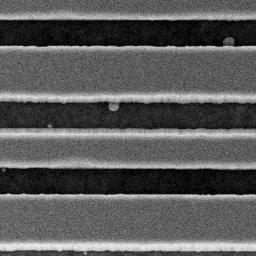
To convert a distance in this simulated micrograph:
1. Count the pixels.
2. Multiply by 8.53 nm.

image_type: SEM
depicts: lines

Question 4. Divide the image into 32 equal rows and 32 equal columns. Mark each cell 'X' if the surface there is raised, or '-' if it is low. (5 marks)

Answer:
XXXXXXXXXXXXXXXXXXXXXXXXXXXXXXXX
XXXXXXXXXXXXXXXXXXXXXXXXXXXXXXXX
--------------------------------
--------------------------------
--------------------------------
--------------------------------
XXXXXXXXXXXXXXXXXXXXXXXXXXXXXXXX
XXXXXXXXXXXXXXXXXXXXXXXXXXXXXXXX
XXXXXXXXXXXXXXXXXXXXXXXXXXXXXXXX
XXXXXXXXXXXXXXXXXXXXXXXXXXXXXXXX
XXXXXXXXXXXXXXXXXXXXXXXXXXXXXXXX
XXXXXXXXXXXXXXXXXXXXXXXXXXXXXXXX
-XXXXXXXXXXXXXXXXXXXXXXXXXXXXXXX
--------------------------------
--------------------------------
--------------------------------
XXXXXXXXXXXXXXXXXXXXXXXXXX-XXXXX
XXXXXXXXXXXXXXXXXXXXXXXXXXXXXXXX
XXXXXXXXXXXXXXXXXXXXXXXXXXXXXXXX
XXXXXXXXXXXXXXXXXXXXXXXXXXXXXXXX
XXXXXXXXXXXXXXXXXXXXXXXXXXXXXXXX
--------------------------------
--------------------------------
--------------------------------
XXXXXXXXXXXXXXXXXXXXXXXXXXXXXXXX
XXXXXXXXXXXXXXXXXXXXXXXXXXXXXXXX
XXXXXXXXXXXXXXXXXXXXXXXXXXXXXXXX
XXXXXXXXXXXXXXXXXXXXXXXXXXXXXXXX
XXXXXXXXXXXXXXXXXXXXXXXXXXXXXXXX
XXXXXXXXXXXXXXXXXXXXXXXXXXXXXXXX
XXXXXXXXXXXXXXXXXXXXXXXXXXXXXXXX
--------------------------------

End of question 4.